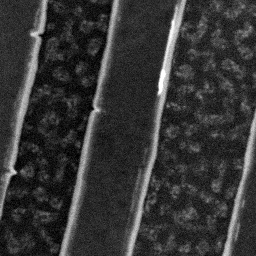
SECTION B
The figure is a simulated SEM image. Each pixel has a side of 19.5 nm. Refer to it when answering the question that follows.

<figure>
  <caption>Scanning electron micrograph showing one or a few lines or trenches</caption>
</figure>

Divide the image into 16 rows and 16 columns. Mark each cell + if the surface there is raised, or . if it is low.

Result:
+++....++++.....
+++....++++.....
++.....++++.....
++.....++++.....
++....++++......
++....++++......
++....++++......
+.....++++......
+....+++++......
+....+++++......
+....++++......+
.....++++......+
.....++++......+
....+++++......+
....++++......++
....++++......++